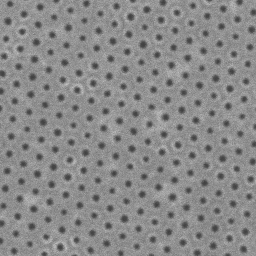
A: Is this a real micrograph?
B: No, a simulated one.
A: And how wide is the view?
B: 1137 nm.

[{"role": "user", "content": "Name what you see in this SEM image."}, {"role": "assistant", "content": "a regular array of holes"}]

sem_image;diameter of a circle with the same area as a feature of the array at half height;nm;28.3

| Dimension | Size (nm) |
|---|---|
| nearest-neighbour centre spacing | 76.7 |